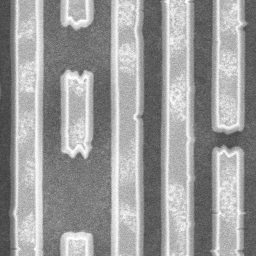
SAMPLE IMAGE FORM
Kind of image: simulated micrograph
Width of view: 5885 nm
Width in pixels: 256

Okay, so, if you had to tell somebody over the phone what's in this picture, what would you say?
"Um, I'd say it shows parallel lines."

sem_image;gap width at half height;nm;598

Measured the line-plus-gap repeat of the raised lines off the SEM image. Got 50.3 pixels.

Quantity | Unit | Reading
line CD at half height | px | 24.4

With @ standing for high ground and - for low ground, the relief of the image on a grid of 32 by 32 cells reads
--@@@---@@@---@@@----@@@---@@@--
--@@@---@@@---@@@----@@@---@@@--
--@@@---@@@---@@@----@@@---@@@--
--@@@---------@@@----@@@---@@@--
--@@@---------@@@----@@@---@@@--
--@@@---------@@@----@@@---@@@--
--@@@---------@@@----@@@---@@@--
--@@@---------@@@----@@@---@@@--
--@@@---------@@@----@@@---@@@--
--@@@---@-----@@@----@@@---@@@--
--@@@---@@@---@@@----@@@---@@@--
--@@@---@@@---@@@----@@@---@@@--
--@@@---@@@---@@@----@@@---@@@--
--@@@---@@@----@@----@@@---@@@--
--@@@---@@@----@@----@@@---@@@--
--@@@---@@@----@@----@@@---@@@--
--@@@---@@@----@@----@@@--------
--@@@---@@@----@@----@@@--------
--@@@---@@@----@@----@@@--------
--@@@----------@@----@@@---@@@--
--@@@----------@@----@@@---@@@--
--@@@---------@@@----@@@---@@@--
--@@@---------@@@----@@@---@@@--
--@@@---------@@@----@@@---@@@--
--@@@---------@@@----@@@---@@@--
--@@@---------@@@----@@@---@@@--
--@@@---------@@@----@@@---@@@--
--@@@---------@@@----@@@---@@@--
--@@@---------@@@----@@@---@@@--
--@@@---------@@@----@@@---@@@--
--@@@---@@@---@@@----@@@---@@@--
--@@@---@@@---@@@----@@@---@@@--